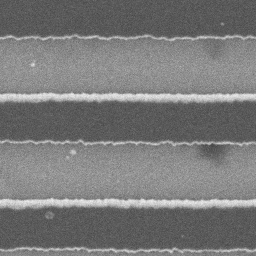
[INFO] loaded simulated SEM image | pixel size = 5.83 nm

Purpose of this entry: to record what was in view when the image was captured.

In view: lines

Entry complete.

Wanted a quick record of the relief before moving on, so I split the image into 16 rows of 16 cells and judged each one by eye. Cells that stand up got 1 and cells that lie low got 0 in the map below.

1111111111111111
1111111111111111
0000000000000000
0000000000000000
0000000000000000
0000000000000000
1111111111111111
1111111111111111
1111111111111111
0000000000000000
0000000000000000
0000000000000000
0000000000000000
1111111111111111
1111111111111111
1111111111111111